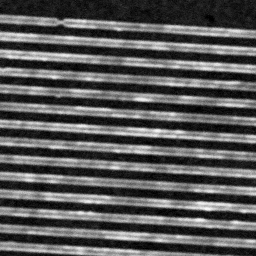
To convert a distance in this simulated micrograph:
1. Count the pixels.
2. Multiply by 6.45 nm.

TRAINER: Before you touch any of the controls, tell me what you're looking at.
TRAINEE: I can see parallel lines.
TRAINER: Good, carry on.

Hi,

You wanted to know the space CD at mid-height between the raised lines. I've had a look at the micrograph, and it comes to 67.6 nm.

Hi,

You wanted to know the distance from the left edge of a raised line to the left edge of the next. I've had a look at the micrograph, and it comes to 112 nm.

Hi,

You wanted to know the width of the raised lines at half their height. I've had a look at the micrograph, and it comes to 41.9 nanometers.